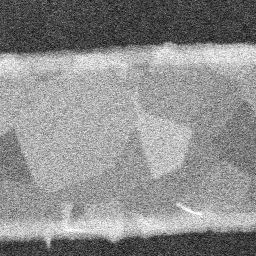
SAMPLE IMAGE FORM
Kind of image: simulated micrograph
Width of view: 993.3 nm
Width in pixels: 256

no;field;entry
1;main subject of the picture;one or a few lines or trenches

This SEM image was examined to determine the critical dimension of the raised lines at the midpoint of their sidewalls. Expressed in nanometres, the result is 637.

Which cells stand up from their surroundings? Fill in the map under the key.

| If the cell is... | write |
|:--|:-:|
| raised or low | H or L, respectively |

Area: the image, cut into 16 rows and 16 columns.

LLLLLLLLLLLLLLLL
LLLLLLLLLLLLLLLL
LLLLLLLLLLLLLLLL
LLLLLLLLLLLLLHHH
HHHHHHHHHHHHHHHH
HHHHHHHHHHHHHHHH
HHHHHHHHHHHHHHHH
HHHHHHHHHHHHHHHH
HHHHHHHHHHHHHHHH
HHHHHHHHHHHHHHHH
HHHHHHHHHHHHHHHH
HHHHHHHHHHHHHHHH
HHHHHHHHHHHHHHHH
HHHHHHHHHHHHHHHH
LLLLLLLLLLLLLLLL
LLLLLLLLLLLLLLLL